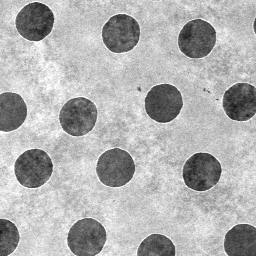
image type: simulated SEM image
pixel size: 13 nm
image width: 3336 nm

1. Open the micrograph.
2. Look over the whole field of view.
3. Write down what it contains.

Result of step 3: a regular array of holes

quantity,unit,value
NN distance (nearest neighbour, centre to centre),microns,0.942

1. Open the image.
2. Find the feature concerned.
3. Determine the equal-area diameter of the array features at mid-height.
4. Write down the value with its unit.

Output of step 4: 513 nm